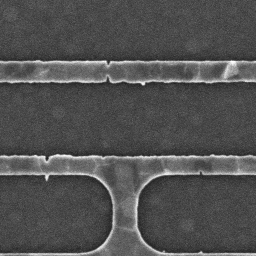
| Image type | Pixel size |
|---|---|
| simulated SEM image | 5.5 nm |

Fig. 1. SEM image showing one or a few lines or trenches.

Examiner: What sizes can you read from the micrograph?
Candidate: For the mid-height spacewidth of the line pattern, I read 410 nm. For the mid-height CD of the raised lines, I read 0.109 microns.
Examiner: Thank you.